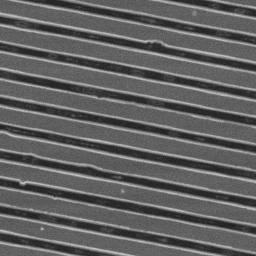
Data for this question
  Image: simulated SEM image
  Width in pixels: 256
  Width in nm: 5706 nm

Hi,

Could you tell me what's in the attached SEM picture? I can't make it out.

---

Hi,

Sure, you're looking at parallel lines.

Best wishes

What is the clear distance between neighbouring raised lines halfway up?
202 nm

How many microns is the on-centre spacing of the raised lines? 0.595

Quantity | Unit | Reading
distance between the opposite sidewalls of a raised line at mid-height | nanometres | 383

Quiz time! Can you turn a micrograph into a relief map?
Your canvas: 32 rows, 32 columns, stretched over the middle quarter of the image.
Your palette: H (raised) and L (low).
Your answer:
HHHHLLLLLLLLLLLLHHHHHHHHHHHHHHHH
HHHHHHHHHLLLLLLLLLLLLLHHHHHHHHHH
HHHHHHHHHHHHHLLLLLLLLLLLLLLHHHHH
HHHHHHHHHHHHHHHHHHHLLLLLLLLLLLLL
LHHHHHHHHHHHHHHHHHHHHHHLLLLLLLLL
LLLLLLHHHHHHHHHHHHHHHHHHHHHHHHLL
LLLLLLLLLLLLHHHHHHHHHHHHHHHHHHHH
HHHHLLLLLLLLLLLLLHHHHHHHHHHHHHHH
HHHHHHHHHLLLLLLLLLLLLLHHHHHHHHHH
HHHHHHHHHHHHHHHLLLLLLLLLLLLLLHHH
HHHHHHHHHHHHHHHHHHHHLLLLLLLLLLLL
LLLHHHHHHHHHHHHHHHHHHHHHHLLLLLLL
LLLLLLLLHHHHHHHHHHHHHHHHHHHHHHLL
HLLLLLLLLLLLLHHHHHHHHHHHHHHHHHHH
HHHHHHLLLLLLLLLLLLLHHHHHHHHHHHHH
HHHHHHHHHHHLLLLLLLLLLLLLHHHHHHHH
HHHHHHHHHHHHHHHHLLLLLLLLLLLLHHHH
HHHHHHHHHHHHHHHHHHHHHHLLLLLLLLLL
LLLLHHHHHHHHHHHHHHHHHHHHHHHLLLLL
LLLLLLLLLLHHHHHHHHHHHHHHHHHHHHHH
HHLLLLLLLLLLLLLHHHHHHHHHHHHHHHHH
HHHHHHLLLLLLLLLLLLLLHHHHHHHHHHHH
HHHHHHHHHHHHLLLLLLLLLLLLHHHHHHHH
HHHHHHHHHHHHHHHHHLLLLLLLLLLLLLLH
HHHHHHHHHHHHHHHHHHHHHHLLLLLLLLLL
LLLLLLLHHHHHHHHHHHHHHHHHHHHLLLLL
LLLLLLLLLLHHHHHHHHHHHHHHHHHHHHHH
HHHLLLLLLLLLLLLHHHHHHHHHHHHHHHHH
HHHHHHHHLLLLLLLLLLLLLHHHHHHHHHHH
HHHHHHHHHHHHHLLLLLLLLLLLLLHHHHHH
HHHHHHHHHHHHHHHHHHHLLLLLLLLLLLLH
LHHHHHHHHHHHHHHHHHHHHHHHLLLLLLLL